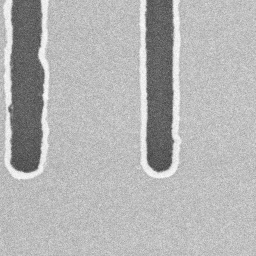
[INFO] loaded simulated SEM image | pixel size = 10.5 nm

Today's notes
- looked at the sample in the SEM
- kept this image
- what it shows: one or a few lines or trenches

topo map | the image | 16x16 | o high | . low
...oooooo..ooooo
o..oooooo..ooooo
o..oooooo..ooooo
...oooooo..ooooo
...oooooo..ooooo
...oooooo..ooooo
...oooooo..ooooo
...oooooo..ooooo
...oooooo..ooooo
...oooooo..ooooo
o.ooooooo..ooooo
oooooooooooooooo
oooooooooooooooo
oooooooooooooooo
oooooooooooooooo
oooooooooooooooo